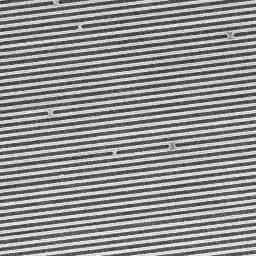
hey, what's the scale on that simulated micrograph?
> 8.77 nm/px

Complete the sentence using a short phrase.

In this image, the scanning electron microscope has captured parallel lines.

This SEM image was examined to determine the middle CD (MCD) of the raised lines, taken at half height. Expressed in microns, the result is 0.0228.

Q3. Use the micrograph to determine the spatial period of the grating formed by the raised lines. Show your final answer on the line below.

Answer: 59.7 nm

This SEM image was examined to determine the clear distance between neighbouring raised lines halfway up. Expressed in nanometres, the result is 39.2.